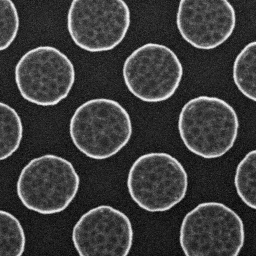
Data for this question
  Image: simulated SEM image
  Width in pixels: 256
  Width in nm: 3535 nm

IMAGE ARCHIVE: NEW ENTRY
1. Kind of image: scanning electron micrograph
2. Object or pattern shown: raised bodies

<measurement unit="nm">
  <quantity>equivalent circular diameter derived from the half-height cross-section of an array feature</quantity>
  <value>791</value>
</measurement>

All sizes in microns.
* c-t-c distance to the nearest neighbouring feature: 1.05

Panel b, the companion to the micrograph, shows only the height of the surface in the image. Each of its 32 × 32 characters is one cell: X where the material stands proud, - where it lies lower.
XX-------XXXXXX--------XXXXX----
XX-------XXXXXXX------XXXXXXX---
XX-------XXXXXXX------XXXXXXX---
XX-------XXXXXXX------XXXXXXX---
XX-------XXXXXX--------XXXXX----
X---------XXXX----------XXX-----
----XXX----------XXXX---------XX
---XXXXX--------XXXXXX--------XX
--XXXXXXX-------XXXXXXX------XXX
--XXXXXXX-------XXXXXXX------XXX
--XXXXXXX-------XXXXXX--------XX
---XXXXX---------XXXX---------XX
----XXX-----X------X----XXX-----
X---------XXXXX--------XXXXXX---
XX-------XXXXXXX-------XXXXXX---
XXX------XXXXXXX------XXXXXXXX--
XXX------XXXXXXX-------XXXXXX---
XX-------XXXXXXX-------XXXXXX---
XX--------XXXXX---------XXXXX---
X----------XXX----XXX-----X----X
----XXXXX--------XXXXX--------XX
---XXXXXX-------XXXXXXX-------XX
--XXXXXXXX------XXXXXXX-------XX
--XXXXXXXX------XXXXXXX-------XX
---XXXXXX--------XXXXXX-------XX
---XXXXX---------XXXXX----X----X
-----------XXXX---------XXXXX---
XX--------XXXXXX-------XXXXXXX--
XXX------XXXXXXX-------XXXXXXX--
XXX------XXXXXXX-------XXXXXXX--
XXX------XXXXXXX-------XXXXXXX--
XXX-------XXXXXX-------XXXXXXX--